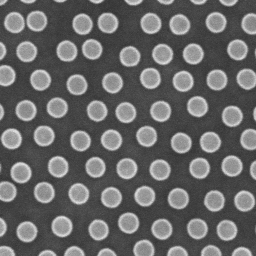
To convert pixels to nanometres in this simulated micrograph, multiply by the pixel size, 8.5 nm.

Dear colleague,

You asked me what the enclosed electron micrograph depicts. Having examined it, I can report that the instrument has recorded a regular array of raised bodies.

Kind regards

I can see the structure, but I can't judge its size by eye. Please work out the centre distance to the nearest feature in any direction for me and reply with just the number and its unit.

0.255 um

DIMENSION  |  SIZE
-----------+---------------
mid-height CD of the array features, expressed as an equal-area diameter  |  166 nm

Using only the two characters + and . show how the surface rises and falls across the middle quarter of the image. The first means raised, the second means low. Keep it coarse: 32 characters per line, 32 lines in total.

................................
....................+++.........
...........++......+++++....+++.
..+++.....++++.....+++++....++++
.++++.....+++++.....++++....++++
.++++.....+++++.....+++.....++++
.++++......+++...............++.
..++............................
................................
.......++......................+
+.....++++....+++.....++++.....+
+.....++++...+++++....+++++....+
......++++...+++++....++++......
.......+++....+++......+++......
................................
................................
...................++++.........
...+++....++++....+++++.....++..
..++++....++++....+++++....++++.
..++++....++++.....++++....+++++
..++++....++++.............+++++
...++.......................+++.
................................
................................
......++++....+++......++.......
+....+++++...+++++....++++......
+.....++++...+++++....++++......
......+++.....++++....++++......
.......................++.......
................................
..+++...........................
.+++++....+++.....++++......+...